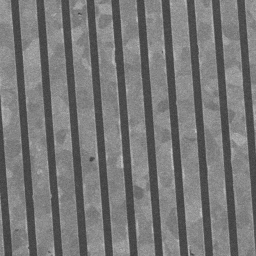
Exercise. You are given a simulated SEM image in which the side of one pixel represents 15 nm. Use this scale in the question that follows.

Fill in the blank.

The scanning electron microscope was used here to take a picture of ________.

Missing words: parallel lines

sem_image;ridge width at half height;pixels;16.7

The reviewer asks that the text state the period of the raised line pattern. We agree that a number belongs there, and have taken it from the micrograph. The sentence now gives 0.375 micrometres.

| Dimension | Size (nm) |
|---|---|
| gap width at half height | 123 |